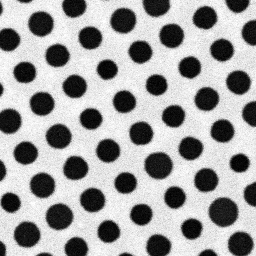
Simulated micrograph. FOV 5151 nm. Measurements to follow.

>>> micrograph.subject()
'a regular array of holes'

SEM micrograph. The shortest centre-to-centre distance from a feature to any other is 718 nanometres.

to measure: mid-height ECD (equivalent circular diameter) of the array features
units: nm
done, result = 480